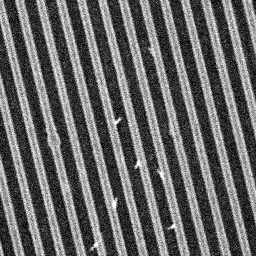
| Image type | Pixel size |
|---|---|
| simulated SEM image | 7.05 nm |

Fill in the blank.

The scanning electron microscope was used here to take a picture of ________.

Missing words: parallel lines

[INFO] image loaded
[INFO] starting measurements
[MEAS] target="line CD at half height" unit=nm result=56.5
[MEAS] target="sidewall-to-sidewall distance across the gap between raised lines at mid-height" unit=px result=12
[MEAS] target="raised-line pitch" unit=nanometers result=142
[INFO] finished